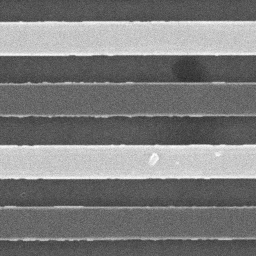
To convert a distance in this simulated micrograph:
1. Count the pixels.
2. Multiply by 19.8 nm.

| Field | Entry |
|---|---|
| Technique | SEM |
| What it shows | lines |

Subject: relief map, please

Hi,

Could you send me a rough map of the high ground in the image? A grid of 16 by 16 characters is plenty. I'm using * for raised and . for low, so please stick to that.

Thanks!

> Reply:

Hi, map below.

................
****************
****************
................
................
****************
****************
................
................
****************
****************
................
................
****************
****************
................